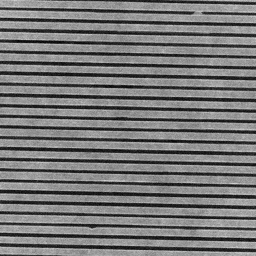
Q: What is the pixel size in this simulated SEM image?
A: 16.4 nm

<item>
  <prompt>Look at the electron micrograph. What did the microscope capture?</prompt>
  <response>parallel lines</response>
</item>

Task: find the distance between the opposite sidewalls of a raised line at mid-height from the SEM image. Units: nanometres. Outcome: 111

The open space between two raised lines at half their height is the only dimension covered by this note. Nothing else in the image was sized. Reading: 3.87 pixels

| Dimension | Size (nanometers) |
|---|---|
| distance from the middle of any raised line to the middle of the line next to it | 176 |